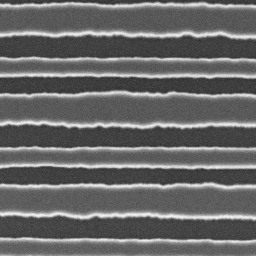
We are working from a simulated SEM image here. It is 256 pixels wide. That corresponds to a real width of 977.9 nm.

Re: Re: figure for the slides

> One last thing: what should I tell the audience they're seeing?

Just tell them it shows lines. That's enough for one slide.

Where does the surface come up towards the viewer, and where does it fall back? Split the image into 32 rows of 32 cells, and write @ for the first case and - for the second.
------@@@@@@------@@------------
@@@@@@@@@@@@@@@@@@@@@@@@@@@@@@@@
@@@@@@@@@@@@@@@@@@@@@@@@@@@@@@@@
@@@@@@@@@@@@@@@@@@@@@@@@@@@@@@@@
--------------------@--------@@@
--------------------------------
--------------------------------
@@@@@@@@@@@@@@@@@@@@@@@@@@@@@@@@
@@@@@@@@@@@@@@@@@@@@@@@@@@@@@@@@
@@-@--@@----@--@@@@@@@@@@@@@@@@@
--------------------------------
--------------------------------
@@@@@@@@@@@@@@@@@@@@@@@@@@@@@@@@
@@@@@@@@@@@@@@@@@@@@@@@@@@@@@@@@
@@@@@@@@@@@@@@@@@@@@@@@@@@@@@@@@
------@-@@@@@@@@@@@@@@@@@@@@@@@@
--------------------------------
--------------------------------
--@@@-@--@@@@@@--@@@@-@@@@@@----
@@@@@@@@@@@@@@@@@@@@@@@@@@@@@@@@
@@@@@@@@@@@@@@@@@@@@@@@@@@@@@@@@
--------------------------------
--------------------------------
@@@@@@@@@@@@@@@@@@@@@@@@@@@@@@@@
@@@@@@@@@@@@@@@@@@@@@@@@@@@@@@@@
@@@@@@@@@@@@@@@@@@@@@@@@@@@@@@@@
@@@@@@@@@@@@@@@@@@@@@@@@@@@@@@@@
--------------------------------
--------------------------------
--------------------------------
@@@@@@@@@@@@@@@@@@@@@@@@@@@@@@@@
@@@@@@@@@@@@@@@@@@@@@@@@@@@@@@@@